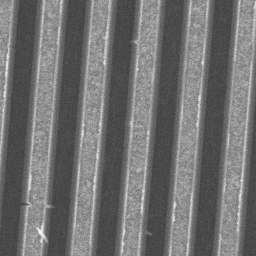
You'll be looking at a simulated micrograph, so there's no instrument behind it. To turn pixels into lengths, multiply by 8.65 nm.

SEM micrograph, parallel lines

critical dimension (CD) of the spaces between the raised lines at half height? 0.225 microns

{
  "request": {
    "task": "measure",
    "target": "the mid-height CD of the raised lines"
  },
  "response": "202 nm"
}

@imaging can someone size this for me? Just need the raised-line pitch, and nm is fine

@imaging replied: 421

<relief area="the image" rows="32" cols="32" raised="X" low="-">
XX---XXX---XXX---XXX---XXX----XX
XX---XXX---XXX---XXX---XXX----XX
XX---XXX---XXX---XXX---XXX----XX
XX---XXX---XXX---XXX---XXX---XXX
X----XXX---XXX---XXX---XXX---XXX
X----XXX---XXX---XXX---XXX---XXX
X----XXX---XXX---XXX---XXX---XXX
X----XX----XXX---XXX---XXX---XXX
X---XXX----XX----XX----XXX---XXX
X---XXX---XXX----XX----XXX---XXX
X---XXX---XXX----XX----XXX---XXX
X---XXX---XXX----XX----XX----XXX
X---XXX---XXX---XXX---XXX----XX-
X---XXX---XXX---XXX---XXX----XX-
X---XXX---XXX---XXX---XXX----XX-
X---XXX---XXX---XXX---XXX---XXX-
X---XXX---XXX---XXX---XXX---XXX-
X---XXX---XXX---XXX---XXX---XXX-
----XXX---XXX---XXX---XXX---XXX-
----XX----XXX---XXX---XXX---XXX-
----XX----XX----XXX---XXX---XXX-
---XXX---XXX----XX----XXX---XXX-
---XXX---XXX----XX----XXX---XXX-
---XXX---XXX----XX----XX----XXX-
---XXX---XXX---XXX----XX----XX--
---XXX---XXX---XXX---XXX----XX--
---XXX---XXX---XXX---XXX----XX--
---XXX---XXX---XXX---XXX---XXX--
---XXX---XXX---XXX---XXX---XXX--
---XXX---XXX---XXX---XXX---XXX--
---XXX---XXX---XXX---XXX---XXX--
---XX----XXX---XXX---XXX---XXX--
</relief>